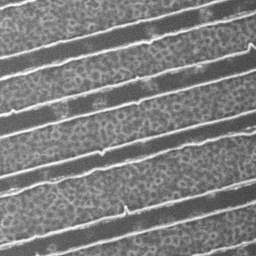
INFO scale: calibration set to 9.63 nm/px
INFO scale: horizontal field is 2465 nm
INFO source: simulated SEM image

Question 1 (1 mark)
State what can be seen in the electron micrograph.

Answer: one or a few lines or trenches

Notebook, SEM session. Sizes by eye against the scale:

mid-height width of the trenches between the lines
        366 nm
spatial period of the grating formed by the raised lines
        584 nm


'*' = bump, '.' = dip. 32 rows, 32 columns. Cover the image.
***.......................******
......................**********
..................***********...
..............***********.......
...........**********...........
.......**********...............
...**********.................**
*********..................*****
*****..................*********
**.................***********..
...............***********......
...........***********..........
.......***********..............
...***********..................
**********....................**
******...................*******
***...................**********
..................*********.....
..............*********.........
..........*********.............
......*********.................
..*********.....................
********........................
****........................****
.........................*******
....................***********.
.................***********....
............************........
.........***********............
.....***********................
.***********..................**
*********.................******